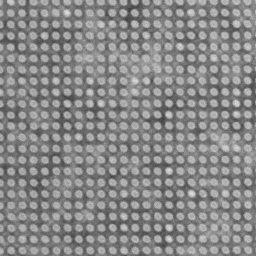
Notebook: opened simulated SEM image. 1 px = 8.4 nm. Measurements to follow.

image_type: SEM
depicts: a regular array of raised bodies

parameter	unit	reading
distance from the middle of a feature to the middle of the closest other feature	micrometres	0.0933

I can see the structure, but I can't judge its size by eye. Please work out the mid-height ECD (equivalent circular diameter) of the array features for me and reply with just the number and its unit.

61.4 nm